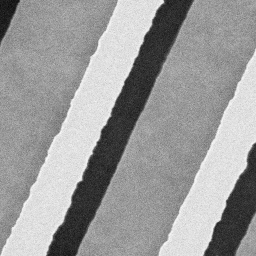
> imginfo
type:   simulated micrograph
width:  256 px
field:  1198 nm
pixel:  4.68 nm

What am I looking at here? lines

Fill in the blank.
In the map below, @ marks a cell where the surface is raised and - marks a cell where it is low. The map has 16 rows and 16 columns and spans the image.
-@@@@@@@@@--@@@@
-@@@@@@@@--@@@@@
@@@@@@@@@--@@@@@
@@@@@@@@@--@@@@@
@@@@@@@@--@@@@@@
@@@@@@@@--@@@@@@
@@@@@@@--@@@@@@@
@@@@@@@--@@@@@@@
@@@@@@--@@@@@@@@
@@@@@@--@@@@@@@@
@@@@@--@@@@@@@@-
@@@@@--@@@@@@@@-
@@@@--@@@@@@@@--
@@@@--@@@@@@@@--
@@@--@@@@@@@@--@
@@@--@@@@@@@@--@